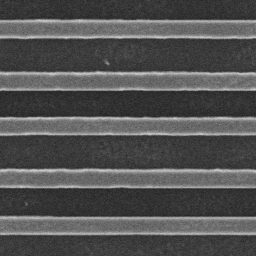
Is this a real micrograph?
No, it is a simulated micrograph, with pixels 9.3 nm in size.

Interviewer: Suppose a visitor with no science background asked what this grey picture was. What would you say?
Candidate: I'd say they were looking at lines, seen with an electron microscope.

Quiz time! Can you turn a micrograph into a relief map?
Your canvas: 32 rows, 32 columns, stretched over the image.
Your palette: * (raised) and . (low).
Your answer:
................................
................................
................................
********************************
********************************
................................
................................
................................
................................
********************************
********************************
................................
................................
................................
................................
********************************
********************************
................................
................................
................................
................................
********************************
********************************
................................
................................
................................
................................
********************************
********************************
................................
................................
................................